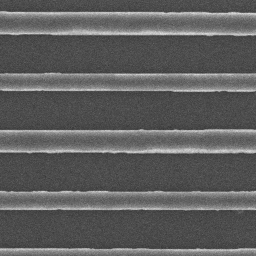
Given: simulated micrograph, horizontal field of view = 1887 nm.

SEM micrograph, lines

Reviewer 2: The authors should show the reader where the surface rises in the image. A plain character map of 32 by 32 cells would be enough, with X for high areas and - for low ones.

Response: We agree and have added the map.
--------------------------------
--------------------------------
XXXXXXXXXXXXXXXXXXXXXXXXXXXXXXXX
XXXXXXXXXXXXXXXXXXXXXXXXXXXXXXXX
--------------------------------
--------------------------------
--------------------------------
--------------------------------
--------------------------------
XXXXXXXXXXXXXXXXXXXXXXXXXXXXXXXX
XXXXXXXXXXXXXXXXXXXXXXXXXXXXXXXX
--------------------------------
--------------------------------
--------------------------------
--------------------------------
--------------------------------
XXXXXXXXXXXXXXXXXXXXXXXXXXXXXXXX
XXXXXXXXXXXXXXXXXXXXXXXXXXXXXXXX
XXXXXXXXXXXXXXXXXXXXXXXXXXXXXXXX
--------------------------------
--------------------------------
--------------------------------
--------------------------------
--------------------------------
XXXXXXXXXXXXXXXXXXXXXXXXXXXXXXXX
XXXXXXXXXXXXXXXXXXXXXXXXXXXXXXXX
--------------------------------
--------------------------------
--------------------------------
--------------------------------
--------------------------------
XXXXXXXXXXXXXXXXXXXXXXXXXXXXXXXX